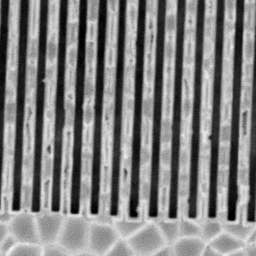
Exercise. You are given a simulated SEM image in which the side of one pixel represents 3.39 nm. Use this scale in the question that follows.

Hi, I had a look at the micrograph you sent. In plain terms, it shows parallel lines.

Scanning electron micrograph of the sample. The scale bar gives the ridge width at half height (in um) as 0.0369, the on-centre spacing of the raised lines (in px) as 19.6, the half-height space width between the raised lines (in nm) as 27.6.